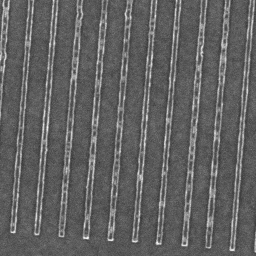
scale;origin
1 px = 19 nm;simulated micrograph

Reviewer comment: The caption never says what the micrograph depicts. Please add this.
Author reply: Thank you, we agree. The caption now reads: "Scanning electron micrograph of parallel lines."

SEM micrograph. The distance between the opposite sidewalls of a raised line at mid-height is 92.3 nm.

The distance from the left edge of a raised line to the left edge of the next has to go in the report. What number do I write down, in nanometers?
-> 464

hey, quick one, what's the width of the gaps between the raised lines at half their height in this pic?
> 376 nanometres